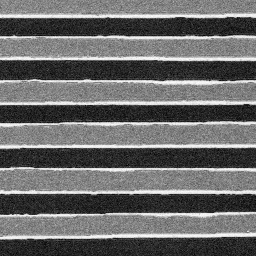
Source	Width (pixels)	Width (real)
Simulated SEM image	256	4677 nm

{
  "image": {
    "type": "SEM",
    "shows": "lines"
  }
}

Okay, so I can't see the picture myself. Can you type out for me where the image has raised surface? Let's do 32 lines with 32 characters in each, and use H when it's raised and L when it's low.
HHHHHHHHHHHHHHHHHHHHHHHHHHHHHHHH
HHHHHHHHHHHHHHHHHHHHHHHHHHHHHHHH
LLLLLLLLLLLLLLLLLLLLLLLLLLLLLLLL
LLLLLLLLLLLLLLLLLLLLLLLLLLLLLLLL
LLLLLLLLLLLLLLLLLLLLLLLLLLLLLLLL
HHHHHHHHHHHHHHHHHHHHHHHHHHHHHHHH
HHHHHHHHHHHHHHHHHHHHHHHHHHHHHHHH
LLLLLLLLLLLLLLLLLLLLLLLLLLLLLLLL
LLLLLLLLLLLLLLLLLLLLLLLLLLLLLLLL
LLLLLLLLLLLLLLLLLLLLLLLLLLLLLLLL
HHHHHHHHHHHHHHHHHHHHHHHHHHHHHHHH
HHHHHHHHHHHHHHHHHHHHHHHHHHHHHHHH
HHHHHHHHHHHHHHHHHHHHHHHHHHHHHHHH
LLLLLLLLLLLLLLLLLLLLLLLLLLLLLLLL
LLLLLLLLLLLLLLLLLLLLLLLLLLLLLLLL
LLLLLLLLLLLLLLLHHLLHHHLLHHHHHHHH
HHHHHHHHHHHHHHHHHHHHHHHHHHHHHHHH
HHHHHHHHHHHHHHHHHHHHHHHHHHHHHHHH
LLLLLLLLLLLLLLLLLLLLLLLLLLLLLLLL
LLLLLLLLLLLLLLLLLLLLLLLLLLLLLLLL
LLLLLLLLLLLLLLLLLLLLLLLLLLLLLLLL
HHHHHHHHHHHHHHHHHHHHHHHHHHHHHHHH
HHHHHHHHHHHHHHHHHHHHHHHHHHHHHHHH
HHHHHHHHHHHHHHHHHHHHHHHHHHHHHHHH
LLLLLLLLLLLLLLLLLLLLLLLLLLLLLLLL
LLLLLLLLLLLLLLLLLLLLLLLLLLLLLLLL
LLLLLLLLLLLLLLLLLLLLLLLLLLLLLLLL
HHHHHHHHHHHHHHHHHHHHHHHHHHHHHHHH
HHHHHHHHHHHHHHHHHHHHHHHHHHHHHHHH
HHHHHHHHHHHHHHHHHHHHHHHLLLLLLLLL
LLLLLLLLLLLLLLLLLLLLLLLLLLLLLLLL
LLLLLLLLLLLLLLLLLLLLLLLLLLLLLLLL